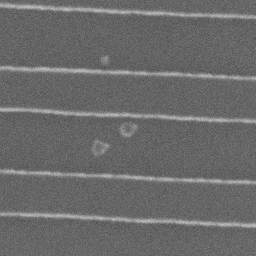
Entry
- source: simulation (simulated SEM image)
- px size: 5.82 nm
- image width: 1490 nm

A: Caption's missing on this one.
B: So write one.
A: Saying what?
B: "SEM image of lines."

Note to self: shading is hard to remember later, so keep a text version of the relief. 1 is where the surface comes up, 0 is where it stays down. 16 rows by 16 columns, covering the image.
0011111111111111
0000000000000000
0000000000000000
0000000000000000
1111111100000000
1111111111111111
1111111111111111
0000000000000111
0000000000000000
0000000000000000
0000000000000000
1111111111111111
1111111111111111
0001111111111111
0000000000000000
0000000000000000